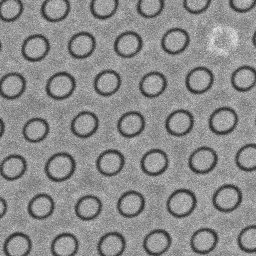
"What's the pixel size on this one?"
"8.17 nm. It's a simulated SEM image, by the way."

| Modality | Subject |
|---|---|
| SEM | a regular array of ring-shaped grooves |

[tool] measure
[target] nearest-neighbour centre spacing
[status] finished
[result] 372 nanometers